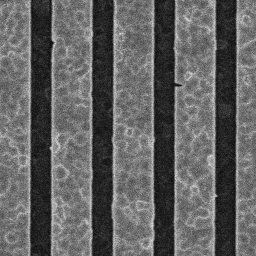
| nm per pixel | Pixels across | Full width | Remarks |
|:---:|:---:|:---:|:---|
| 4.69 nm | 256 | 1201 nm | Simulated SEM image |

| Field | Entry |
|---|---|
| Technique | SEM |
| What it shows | parallel lines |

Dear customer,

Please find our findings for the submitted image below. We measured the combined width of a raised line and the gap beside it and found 0.289 microns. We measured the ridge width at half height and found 183 nm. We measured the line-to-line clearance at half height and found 104 nanometers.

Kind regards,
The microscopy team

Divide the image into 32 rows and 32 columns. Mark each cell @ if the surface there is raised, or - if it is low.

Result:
@@@@--@@@@@---@@@@@---@@@@@---@@
@@@@---@@@@---@@@@@---@@@@@---@@
@@@@---@@@@---@@@@@---@@@@@---@@
@@@@---@@@@---@@@@@---@@@@@---@@
@@@@---@@@@---@@@@@---@@@@@---@@
@@@@---@@@@---@@@@@---@@@@@---@@
@@@@---@@@@---@@@@@---@@@@@---@@
@@@@---@@@@---@@@@@---@@@@@---@@
@@@@---@@@@---@@@@@---@@@@@---@@
@@@@---@@@@---@@@@@---@@@@@---@@
@@@@---@@@@---@@@@@---@@@@@---@@
@@@@---@@@@---@@@@@---@@@@@---@@
@@@@---@@@@---@@@@@---@@@@@---@@
@@@@---@@@@---@@@@@---@@@@@---@@
@@@@---@@@@---@@@@@---@@@@@---@@
@@@@---@@@@---@@@@@---@@@@@---@@
@@@@---@@@@---@@@@@---@@@@@---@@
@@@@---@@@@---@@@@@---@@@@@---@@
@@@@--@@@@@---@@@@@---@@@@@---@@
@@@@---@@@@---@@@@@---@@@@@---@@
@@@@---@@@@---@@@@@---@@@@@---@@
@@@@---@@@@---@@@@@---@@@@@---@@
@@@@---@@@@---@@@@@---@@@@@---@@
@@@@---@@@@---@@@@@---@@@@@---@@
@@@@---@@@@---@@@@@---@@@@@---@@
@@@@---@@@@---@@@@@---@@@@@---@@
@@@@---@@@@---@@@@@---@@@@@---@@
@@@@---@@@@---@@@@@---@@@@@---@@
@@@@---@@@@---@@@@@---@@@@@---@@
@@@@---@@@@---@@@@@---@@@@@---@@
@@@@---@@@@---@@@@@---@@@@@---@@
@@@@---@@@@---@@@@@---@@@@@---@@